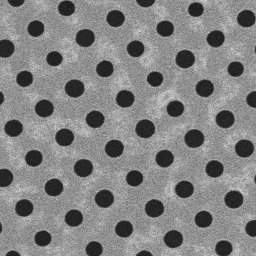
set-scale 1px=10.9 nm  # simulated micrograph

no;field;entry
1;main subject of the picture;a regular array of holes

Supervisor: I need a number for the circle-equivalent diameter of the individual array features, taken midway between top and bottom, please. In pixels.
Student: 17.6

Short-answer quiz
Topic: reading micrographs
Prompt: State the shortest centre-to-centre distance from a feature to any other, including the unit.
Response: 387 nanometres